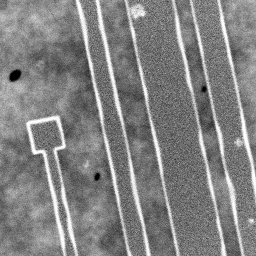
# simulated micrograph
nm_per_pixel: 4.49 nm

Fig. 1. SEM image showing groups of lines, slits or small figures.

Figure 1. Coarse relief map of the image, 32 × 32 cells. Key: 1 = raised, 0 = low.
00000000001100001111110011100000
00000000001100001111110011110000
00000000001110001111110011110000
00000000000110000111110011110000
00000000000110000111110001110000
00000000000110000111111001110000
00000000000110000111111001111000
00000000000111000111111001111000
00000000000111000011111000111000
00000000000011000011111100111000
00000000000011000011111100111100
00000000000011000011111100111100
00000000000011100011111100111100
00000000000011100011111100011100
00000000000001100001111110011100
00001110000001100001111110011100
00001111000001110001111110011110
00001111000001110001111110001110
00001111000001110000111110001110
00000010000000110000111111001110
00000010000000110000111111001111
00000011000000111000111111001111
00000011000000111000111111000111
00000011000000111000011111000111
00000001000000011000011111100111
00000001000000011000011111100111
00000001100000011000011111100111
00000001100000011100011111100111
00000000100000011100001111100011
00000000100000001100001111110011
00000000100000001100001111110011
00000000110000001100001111110011